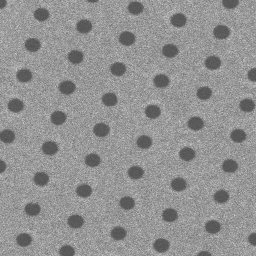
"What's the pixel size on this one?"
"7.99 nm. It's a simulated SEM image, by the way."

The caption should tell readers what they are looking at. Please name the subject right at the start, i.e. a regular array of holes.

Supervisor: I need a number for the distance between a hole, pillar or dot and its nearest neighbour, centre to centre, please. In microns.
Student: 0.252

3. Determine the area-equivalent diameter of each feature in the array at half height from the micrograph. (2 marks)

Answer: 0.118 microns